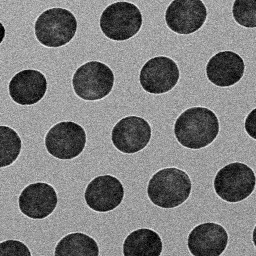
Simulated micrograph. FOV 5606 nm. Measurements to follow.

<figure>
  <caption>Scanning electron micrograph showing a regular array of holes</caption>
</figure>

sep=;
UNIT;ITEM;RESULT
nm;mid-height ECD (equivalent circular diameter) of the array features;862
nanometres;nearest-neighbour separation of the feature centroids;1430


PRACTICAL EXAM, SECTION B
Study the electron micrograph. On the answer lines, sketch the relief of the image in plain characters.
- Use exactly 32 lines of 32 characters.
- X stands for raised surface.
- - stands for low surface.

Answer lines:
XXXXXXXXXXXXXX---XXXX----XXXX---
XXXXX----XXXX-----XXX-----XXX---
XXXXX-----XXX-----XXX-----XXX---
-XXX------XXX-----XXX----XXXXXXX
-XXX-----XXXX----XXXXXXXXXXXXXXX
XXXXX---XXXXXXXXXXXXXXXXXXXXXXXX
XXXXXXXXXXXXXXXXXXXXXXXXXXXX-XXX
XXXXXXXXXXXXXXXXXXX---XXXX----XX
XXXXXXXXXX----XXXX----XXXX-----X
XX---XXXX-----XXX-----XXXX----XX
X-----XXX-----XXXX----XXXXX--XXX
X-----XXX-----XXXXX--XXXXXXXXXXX
XX---XXXXXX-XXXXXXXXXXXXXXXXXXXX
XXXXXXXXXXXXXXXXXXXXXXXX--XXXXXX
XXXXXXXXXXXXXXXXXXXXXX-----XXXX-
XXXXXXX---XXXXX----XXX-----XXXX-
--XXXX-----XXX-----XXX-----XXXX-
---XXX-----XXX-----XXX-----XXXXX
---XXX-----XXXX---XXXXXX-XXXXXXX
--XXXXX---XXXXXXXXXXXXXXXXXXXXXX
-XXXXXXXXXXXXXXXXXXXXXXXXXXXX--X
XXXXXXXXXXXXXXXXXXXX---XXXX-----
XXXXXXXXXXXX---XXXX-----XXX-----
XXX----XXXX----XXX------XXX-----
XX-----XXXX----XXXX-----XXX----X
XX-----XXXX----XXXX----XXXXXXXXX
XXX---XXXXXXXXXXXXXXXXXXXXXXXXXX
XXXXXXXXXXXXXXXXXXXXXXXXXXXXXXXX
XXXXXXXXXXXXXXXXXXXXXXXX----XXXX
XXXXXXXX---XXXXX----XXXX----XXXX
---XXXX-----XXX-----XXX-----XXXX
----XXX-----XXX-----XXXX----XXXX